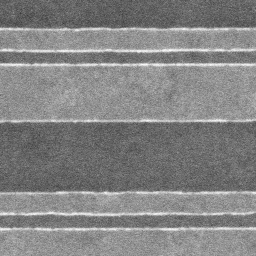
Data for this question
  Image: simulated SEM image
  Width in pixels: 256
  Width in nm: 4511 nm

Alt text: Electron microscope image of lines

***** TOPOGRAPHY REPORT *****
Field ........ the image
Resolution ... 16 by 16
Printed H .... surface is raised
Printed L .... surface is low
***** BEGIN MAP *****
LLLLLLLLLLLLLLLL
LLLLLLLLLLLLLLLL
HHHHHHHHHHHHHHHH
HHHHHHHHHHHHHHHH
HHHHHHHHHHHHHHHH
HHHHHHHHHHHHHHHH
HHHHHHHHHHHHHHHH
HHHHHHHHHHHHHHHH
LLLLLLLLLLLLLLLL
LLLLLLLLLLLLLLLL
LLLLLLLLLLLLLLLL
LLLLLLLLLLLLLLLL
HHHHHHHHHHHHHHHH
HHHHHHHHHHHHHHHH
HHHHHHHHHHHHHHHH
HHHHHHHHHHHHHHHH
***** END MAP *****